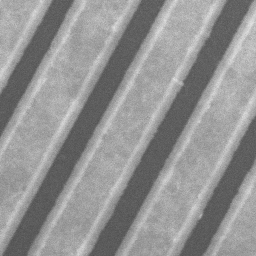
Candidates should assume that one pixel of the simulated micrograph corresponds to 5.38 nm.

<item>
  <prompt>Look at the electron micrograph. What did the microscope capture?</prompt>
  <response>one or a few lines or trenches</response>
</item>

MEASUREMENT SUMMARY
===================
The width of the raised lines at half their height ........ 212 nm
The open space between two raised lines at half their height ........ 207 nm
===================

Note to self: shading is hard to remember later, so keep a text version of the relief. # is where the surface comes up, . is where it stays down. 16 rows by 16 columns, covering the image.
##...###...##...
##..###...###...
#...###...##...#
#..###...###...#
...###..###...##
..###...###..###
..###..###...###
.###...###..###.
.###..###...###.
###...##...###..
###..###...###..
##...##...###...
#...###...##...#
#...##...###...#
...###...##...##
..###...###...##